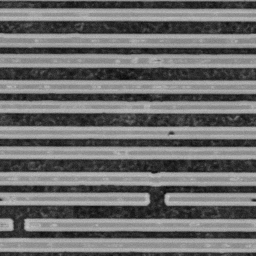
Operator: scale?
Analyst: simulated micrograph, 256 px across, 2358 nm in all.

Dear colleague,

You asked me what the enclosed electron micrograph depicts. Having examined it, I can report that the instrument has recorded parallel lines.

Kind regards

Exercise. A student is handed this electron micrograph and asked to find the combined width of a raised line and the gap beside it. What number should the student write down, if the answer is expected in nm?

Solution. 212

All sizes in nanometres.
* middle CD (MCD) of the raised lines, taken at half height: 81.8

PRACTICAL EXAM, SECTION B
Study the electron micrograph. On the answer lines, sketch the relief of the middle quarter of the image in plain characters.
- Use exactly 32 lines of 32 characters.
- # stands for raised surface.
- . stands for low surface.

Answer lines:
................................
................................
................................
................................
................................
################################
################################
................................
................................
................................
################################
################################
................................
................................
................................
................................
################################
################################
................................
................................
................................
################################
################################
................................
................................
................................
................................
................................
################################
################################
................................
................................